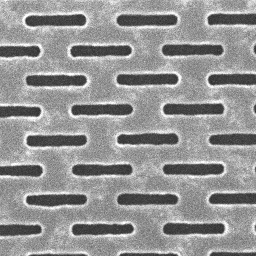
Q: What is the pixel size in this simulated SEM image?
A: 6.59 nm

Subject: a regular array of holes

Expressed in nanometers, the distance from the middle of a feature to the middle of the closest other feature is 355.